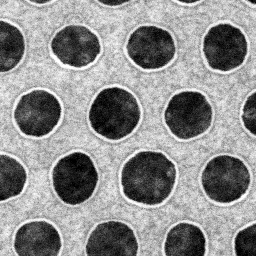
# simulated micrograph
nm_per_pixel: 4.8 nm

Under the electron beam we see a regular array of holes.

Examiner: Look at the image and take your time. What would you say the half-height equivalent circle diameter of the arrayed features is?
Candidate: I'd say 238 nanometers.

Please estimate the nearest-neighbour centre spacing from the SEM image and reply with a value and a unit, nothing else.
0.354 um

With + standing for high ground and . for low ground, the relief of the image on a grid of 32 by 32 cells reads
++++..+++++++..++++++++++++++++.
++++++++++++++++++++++++++++++++
++++++++++++++++++++++++++++++++
..++++++...++++++...++++++....++
...++++.....++++......++++.....+
...+++.......+++......+++......+
...+++.......+++......+++......+
...++++.....++++......++++.....+
..++++++++++++++++..++++++....++
++++++++++++++++++++++++++++++++
++++++++++++++++++++++++++++++++
++++..++++++....++++++...+++++++
++.....+++++.....++++.....+++++.
++......+++.......+++......+++..
++......+++.......+++......+++..
++.....++++......++++.....++++..
+++...++++++.....++++.....+++++.
++++++++++++++.++++++++.++++++++
++++++++++++++++++++++++++++++++
.+++++++...++++++....++++++..+++
...++++.....+++.......++++.....+
...+++......+++.......+++......+
...+++......+++.......+++......+
...++++.....+++.......+++......+
..+++++....+++++.....+++++....++
++++++++..+++++++...++++++++++++
++++++++++++++++++++++++++++++++
++++.+++++++++++++++++++++++++++
++.....+++++....+++++....++++++.
++.....++++......++++.....+++...
++......+++......++++.....+++...
++.....++++......++++.....+++...